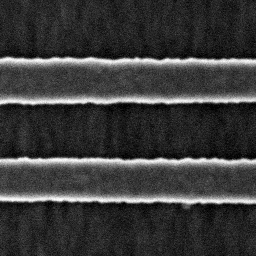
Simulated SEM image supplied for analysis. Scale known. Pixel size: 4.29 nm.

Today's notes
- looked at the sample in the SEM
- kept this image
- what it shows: lines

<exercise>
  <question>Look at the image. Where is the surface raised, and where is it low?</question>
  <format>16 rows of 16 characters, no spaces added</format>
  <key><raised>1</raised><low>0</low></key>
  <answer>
0000000000000000
0000000000000000
0000000000000000
0000000000000000
1111111111111111
1111111111111111
0000000000000000
0000000000000000
0000000000000000
0000000000000000
1111111111111111
1111111111111111
1111111111111111
0000000000000000
0000000000000000
0000000000000000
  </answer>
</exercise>